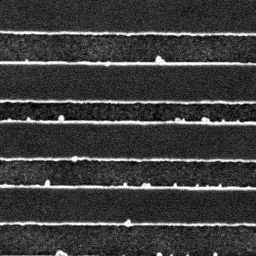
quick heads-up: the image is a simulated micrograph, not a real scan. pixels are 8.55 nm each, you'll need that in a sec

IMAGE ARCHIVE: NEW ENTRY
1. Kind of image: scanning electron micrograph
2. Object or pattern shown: lines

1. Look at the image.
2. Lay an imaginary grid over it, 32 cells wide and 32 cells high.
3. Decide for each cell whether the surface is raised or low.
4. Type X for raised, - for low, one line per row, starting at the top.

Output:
XXXXXXXXXXXXXXXXXXXXXXXXXXXXXXXX
XXXXXXXXXXXXXXXXXXXXXXXXXXXXXXXX
XXXXXXXXXXXXXXXXXXXXXXXXXXXXXXXX
XXXXXXXXXXXXXXXXXXXXXXXXXXXXXXXX
--------------------------------
--------------------------------
--------------------------------
--------------------------------
XXXXXXXXXXXXXXXXXXXXXXXXXXXXXXXX
XXXXXXXXXXXXXXXXXXXXXXXXXXXXXXXX
XXXXXXXXXXXXXXXXXXXXXXXXXXXXXXXX
XXXXXXXXXXXXXXXXXXXXXXXXXXXXXXXX
XXXXXXXXXXXXXXXXXXXXXXXXXXXXXXXX
--------------------------------
--------------------------------
XXXXXXXXXXXXXXXXXXXXXXXXXXXXXXXX
XXXXXXXXXXXXXXXXXXXXXXXXXXXXXXXX
XXXXXXXXXXXXXXXXXXXXXXXXXXXXXXXX
XXXXXXXXXXXXXXXXXXXXXXXXXXXXXXXX
XXXXXXXXXXXXXXXXXXXXXXXXXXXXXXXX
--------------------------------
--------------------------------
--------------------------------
XXXXXXXXXXXXXXXXXXXXXXXX--------
XXXXXXXXXXXXXXXXXXXXXXXXXXXXXXXX
XXXXXXXXXXXXXXXXXXXXXXXXXXXXXXXX
XXXXXXXXXXXXXXXXXXXXXXXXXXXXXXXX
XXXXXXXXXXXXXXXXXXXXXXXXXXXXXXXX
--------------------------------
--------------------------------
--------------------------------
--------------------------------